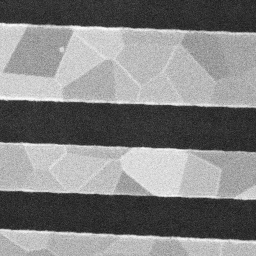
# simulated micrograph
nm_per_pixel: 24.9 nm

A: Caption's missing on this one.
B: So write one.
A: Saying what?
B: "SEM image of lines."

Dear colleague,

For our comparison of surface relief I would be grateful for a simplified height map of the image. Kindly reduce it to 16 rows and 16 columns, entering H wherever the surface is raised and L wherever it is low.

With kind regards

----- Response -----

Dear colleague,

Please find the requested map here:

LLLLLLLLLLLLLLLL
LLLLLLLLLLLLLLLL
HHHHHHHHHHHHHHHH
HHHHHHHHHHHHHHHH
HHHHHHHHHHHHHHHH
HHHHHHHHHHHHHHHH
LLLLLLLLLHHHHHHH
LLLLLLLLLLLLLLLL
LLLLLLLLLLLLLLLL
HHHHHHHHHHHHHHHH
HHHHHHHHHHHHHHHH
HHHHHHHHHHHHHHHH
LLLLLLLLLLLLLLLL
LLLLLLLLLLLLLLLL
HHHLLLLLLLLLLLLL
HHHHHHHHHHHHHHHH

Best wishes